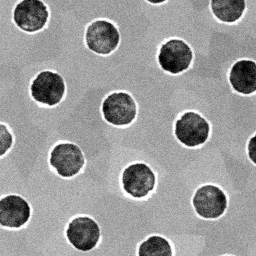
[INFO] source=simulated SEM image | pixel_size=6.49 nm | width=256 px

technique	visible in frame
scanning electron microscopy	a regular array of holes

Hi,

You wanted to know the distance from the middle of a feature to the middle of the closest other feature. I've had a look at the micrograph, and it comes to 478 nm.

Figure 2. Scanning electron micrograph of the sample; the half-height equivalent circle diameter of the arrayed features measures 221 nanometers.